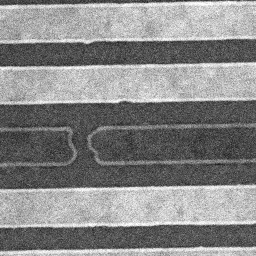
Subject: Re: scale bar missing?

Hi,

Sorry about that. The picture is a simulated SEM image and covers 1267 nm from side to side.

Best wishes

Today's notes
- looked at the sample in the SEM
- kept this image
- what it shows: one or a few lines or trenches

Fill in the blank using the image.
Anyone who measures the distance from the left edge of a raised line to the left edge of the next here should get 61.4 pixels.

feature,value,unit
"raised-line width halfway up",173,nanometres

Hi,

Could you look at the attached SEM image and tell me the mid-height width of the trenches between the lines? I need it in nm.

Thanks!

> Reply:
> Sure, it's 130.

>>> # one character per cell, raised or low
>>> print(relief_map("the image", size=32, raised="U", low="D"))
DDDDDDDDDDDDDDDDDDDUUUUUUUUUUUUU
UUUUUUUUUUUUUUUUUUUUUUUUUUUUUUUU
UUUUUUUUUUUUUUUUUUUUUUUUUUUUUUUU
UUUUUUUUUUUUUUUUUUUUUUUUUUUUUUUU
UUUUUUUUUUUUUUUUUUUUUUUUUUUUUUUU
DDDDDDDDDDDDDDDDDDDDDDDDDDDDDDDD
DDDDDDDDDDDDDDDDDDDDDDDDDDDDDDDD
DDDDDDDDDDDDDDDDDDDDDDDDDDDDDDDD
UUDDDDDUUUUUUUUUUUUUUUUUUUUUUUUU
UUUUUUUUUUUUUUUUUUUUUUUUUUUUUUUU
UUUUUUUUUUUUUUUUUUUUUUUUUUUUUUUU
UUUUUUUUUUUUUUUUUUUUUUUUUUUUUUUU
UUUUUUUUUUUUUUUDUUUUUUDDDDDDDDDD
DDDDDDDDDDDDDDDDDDDDDDDDDDDDDDDD
DDDDDDDDDDDDDDDDDDDDDDDDDDDDDDDD
DDDDDDDDDDDDDDDDDDDDDDDDDDDDDDDD
UUUUUUUUUDDDUUUUUUUUUUUUUUUUUUUU
UUUUUUUUUDDUUUUUUUUUUUUUUUUUUUUU
UUUUUUUUUDDUUUUUUUUUUUUUUUUUUUUU
UUUUUUUUUDDDUUUUUUUUUUUUUUUUUUUU
UUUDUUUUDDDDDDDDDDDDDDDDDDDDDDDD
DDDDDDDDDDDDDDDDDDDDDDDDDDDDDDDD
DDDDDDDDDDDDDDDDDDDDDDDDDDDDDDDD
DDDDDDDDDDDDDDDDDDDUDUUUUUUUUUUU
UUUUUUUUUUUUUUUUUUUUUUUUUUUUUUUU
UUUUUUUUUUUUUUUUUUUUUUUUUUUUUUUU
UUUUUUUUUUUUUUUUUUUUUUUUUUUUUUUU
UUUUUUUUUUUUUUUUUUUUUUUUUUUUUUUU
DDDDDDDDDDDDDDDDDDDDDDDDDDDDDDDD
DDDDDDDDDDDDDDDDDDDDDDDDDDDDDDDD
DDDDDDDDDDDDDDDDDDDDDDDDDDDDDDDD
DDUUUUUUUUUUUUUUUUUUUUUUUUUUUUUU